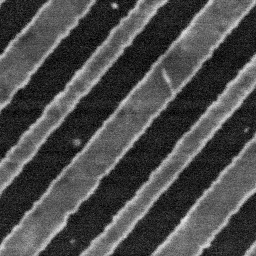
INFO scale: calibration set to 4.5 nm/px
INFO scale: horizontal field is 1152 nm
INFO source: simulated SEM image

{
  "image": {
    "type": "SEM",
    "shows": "lines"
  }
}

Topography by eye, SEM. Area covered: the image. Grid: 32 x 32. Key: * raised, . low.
......******.....***......******
.....******.....***......******.
....******.....****.....******..
...******.....****.....******...
..******......***......*****....
.******......***......*****.....
.*****......***......******.....
*****......***......******.....*
*****.....****.....******......*
****.....****.....******......**
***......***.....******......***
**......***.....******......***.
*......***......*****......***..
......***......*****......****..
.....***......******.....****...
....***......******.....****....
...***......******......***.....
..****.....******......***.....*
..***......*****......***......*
.***......*****......***......**
***......*****......***......***
**......******.....****.....****
**.....******......***.....*****
*.....******......***.....******
.....******......***.....******.
....******......***.....******..
...******......***......*****...
...*****......***......*****....
..******.....****.....******....
.******.....****.....******.....
******.....****.....******......
*****.....****.....******......*